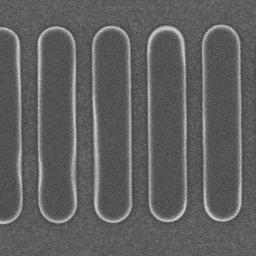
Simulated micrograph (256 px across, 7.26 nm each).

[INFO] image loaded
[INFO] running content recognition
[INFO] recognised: groups of lines, slits or small figures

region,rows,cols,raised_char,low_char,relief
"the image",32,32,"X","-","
--------------------------------
--------------------------------
--------------------------------
------XX-----XX------------XX---
XX---XXXX---XXXX---XXXX---XXXX--
XX---XXXX---XXXX---XXXX--XXXXX--
XX---XXXX---XXXX--XXXXX--XXXXX--
XX---XXXX---XXXX--XXXXX--XXXXX--
XX---XXXX---XXXX--XXXXX--XXXXX--
XX---XXXX---XXXX---XXXX--XXXXX--
XX---XXXX---XXXX---XXXX--XXXXX--
XX---XXXX---XXXX---XXXX--XXXXX--
XX---XXXX---XXXX---XXXX--XXXXX--
XXX--XXXX---XXXX---XXXX--XXXXX--
XXX--XXXX---XXXX---XXXX--XXXXX--
XX---XXXX---XXXX---XXXX--XXXXX--
XXX--XXXX---XXXX---XXXX--XXXXX--
XXX--XXXX---XXXX---XXXX--XXXXX--
XXX--XXXX---XXXX---XXXX--XXXXX--
XX---XXXX---XXXX---XXXX---XXXX--
XX---XXXX---XXXX---XXXX---XXXX--
XX---XXXX---XXXX---XXXX---XXXX--
XXX--XXXX---XXXX---XXXX---XXXX--
XXX--XXXX---XXXX---XXXX---XXXX--
XXX--XXXX---XXXX---XXXX---XXXX--
XXX--XXXX---XXXX---XXXX---XXXX--
XX---XXXX---XXXX---XXXX---XXXX--
XX----XX-----XX-----XX-----X----
--------------------------------
--------------------------------
--------------------------------
--------------------------------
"